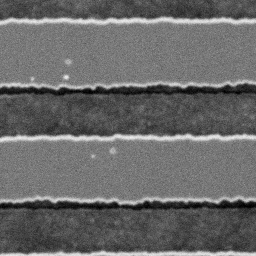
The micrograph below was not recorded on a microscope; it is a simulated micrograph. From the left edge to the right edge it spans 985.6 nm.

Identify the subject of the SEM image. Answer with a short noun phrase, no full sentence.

lines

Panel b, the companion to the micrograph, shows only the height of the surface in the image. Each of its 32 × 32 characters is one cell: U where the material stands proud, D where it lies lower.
DDDDDDDDDDDDDDDDDDDDDDDDDDDDDDDD
DDDDDDDDDDDDDDDDDDDDDDDDDDDDDDDD
DUDUDUUUUUUUDUUUUUUUUUDUUDUUUDUU
UUUUUUUUUUUUUUUUUUUUUUUUUUUUUUUU
UUUUUUUUUUUUUUUUUUUUUUUUUUUUUUUU
UUUUUUUUUUUUUUUUUUUUUUUUUUUUUUUU
UUUUUUUUUUUUUUUUUUUUUUUUUUUUUUUU
UUUUUUUUUUUUUUUUUUUUUUUUUUUUUUUU
UUUUUUUUUUUUUUUUUUUUUUUUUUUUUUUU
UUUUUUUUUUUUUUUUUUUUUUUUUUUUUUUU
UUUUUUUUUUUUUUUUUUUUUUUUUUUUUUDD
DDDDDDDDDDDDDDDDDDDDDDDDDDDDDDDD
DDDDDDDDDDDDDDDDDDDDDDDDDDDDDDDD
DDDDDDDDDDDDDDDDDDDDDDDDDDDDDDDD
DDDDDDDDDDDDDDDDDDDDDDDDDDDDDDDD
DDDDDDDDDDDDDDDDDDDDDDDDDDDDDDDD
DDDDDDDDDDDDDDDDDDDDDDDDDDDDDDDD
UUUUUUUUUUUUUUUUUUUUUUUUUUUUUUUU
UUUUUUUUUUUUUUUUUUUUUUUUUUUUUUUU
UUUUUUUUUUUUUUUUUUUUUUUUUUUUUUUU
UUUUUUUUUUUUUUUUUUUUUUUUUUUUUUUU
UUUUUUUUUUUUUUUUUUUUUUUUUUUUUUUU
UUUUUUUUUUUUUUUUUUUUUUUUUUUUUUUU
UUUUUUUUUUUUUUUUUUUUUUUUUUUUUUUU
UUUUUUUUUUUUUUUUUUUUUUUUUUUUUUUU
DDDDDDDDDDDDDDDDDDDDDDDDDDDDDDDD
DDDDDDDDDDDDDDDDDDDDDDDDDDDDDDDD
DDDDDDDDDDDDDDDDDDDDDDDDDDDDDDDD
DDDDDDDDDDDDDDDDDDDDDDDDDDDDDDDD
DDDDDDDDDDDDDDDDDDDDDDDDDDDDDDDD
DDDDDDDDDDDDDDDDDDDDDDDDDDDDDDDD
DDDDDDDDDDDDDDDDDDDDDDDDDDDDUDDD